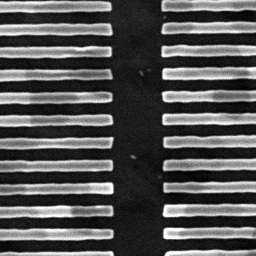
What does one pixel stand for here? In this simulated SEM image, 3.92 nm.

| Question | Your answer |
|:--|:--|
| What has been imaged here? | wiring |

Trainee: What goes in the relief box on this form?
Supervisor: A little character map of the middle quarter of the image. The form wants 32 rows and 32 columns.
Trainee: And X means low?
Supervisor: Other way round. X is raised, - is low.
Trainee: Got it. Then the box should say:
--------------------------------
---XXXXXXXX--------------XXXXXXX
XXXXXXXXXXXX-------------XXXXXXX
XXXXXXXXXXXX-------------XXXXXXX
--------------------------------
--------------------------------
--------------------------------
XXXXXXXXXXXX-------------XXXXXXX
XXXXXXXXXXXX-------------XXXXXXX
XXXXX---------------------------
--------------------------------
--------------------------------
--------------------------------
XXXXXXXXXXXX-------------XXXXXXX
XXXXXXXXXXXX-------------XXXXXXX
--------------------------------
--------------------------------
--------------------------------
-----------X-------------XXXXXXX
XXXXXXXXXXXX-------------XXXXXXX
XXXXXXXXXXXX-------------XXXXXXX
--------------------------------
--------------------------------
--------------------------------
XXXXXXXXXXXX-------------XXXXXXX
XXXXXXXXXXXX-------------XXXXXXX
XXXXXXXXXX-X-------------X---XX-
--------------------------------
--------------------------------
--------------------------------
XXXXXXXXXXXX-------------XXXXXXX
XXXXXXXXXXXX-------------XXXXXXX